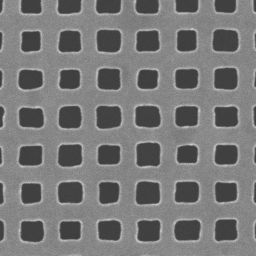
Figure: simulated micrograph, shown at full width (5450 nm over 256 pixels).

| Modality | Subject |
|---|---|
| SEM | a regular array of holes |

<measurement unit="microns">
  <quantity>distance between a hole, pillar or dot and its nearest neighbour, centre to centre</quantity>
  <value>0.805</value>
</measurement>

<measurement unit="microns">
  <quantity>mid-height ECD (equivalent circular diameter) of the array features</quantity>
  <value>0.515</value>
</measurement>